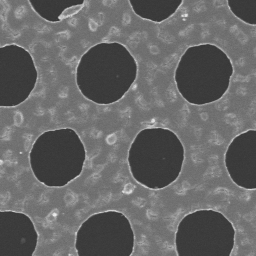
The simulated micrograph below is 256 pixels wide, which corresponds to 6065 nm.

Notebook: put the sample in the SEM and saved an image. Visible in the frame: holes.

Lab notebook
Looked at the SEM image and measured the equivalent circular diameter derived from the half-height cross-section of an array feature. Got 1380 nm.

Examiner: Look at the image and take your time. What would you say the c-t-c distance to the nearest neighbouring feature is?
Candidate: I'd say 2.29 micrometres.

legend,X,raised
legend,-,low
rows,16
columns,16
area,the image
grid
XX--XXXX---XXX--
XXXXXXXXXXXXXXXX
XXXXXXXXXXXXXXXX
--XXX---XXX---XX
--XXX---XXX---XX
--XXX---XXX---XX
-XXXXXXXXXXX-XXX
XXXXXXXXXXXXXXXX
XXX--XXXX--XXXX-
XX---XXX---XXX--
XX---XXX---XXX--
XXX-XXXXX--XXXX-
XXXXXXXXXXXXXXXX
--XXXX--XXXX--XX
--XXX---XXX----X
--XXX---XXX----X